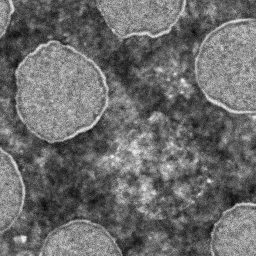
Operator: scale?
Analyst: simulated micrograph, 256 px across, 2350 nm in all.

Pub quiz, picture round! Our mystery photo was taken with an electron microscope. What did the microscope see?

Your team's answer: raised bodies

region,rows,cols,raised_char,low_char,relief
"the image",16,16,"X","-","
X-----XXXXX-----
X------XXXX---XX
-------------XXX
--XXX-------XXXX
-XXXXX------XXXX
-XXXXXX------XXX
-XXXXXX-------XX
-XXXXX----------
--XX------------
----------------
X---------------
X---------------
X---------------
X-------------XX
---XXXX------XXX
---XXXX------XXX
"